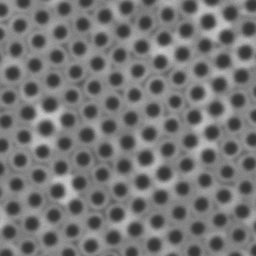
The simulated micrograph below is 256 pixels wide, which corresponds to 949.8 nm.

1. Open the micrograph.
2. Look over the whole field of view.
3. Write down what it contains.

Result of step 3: a regular array of holes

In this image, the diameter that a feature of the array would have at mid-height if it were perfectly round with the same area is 51.3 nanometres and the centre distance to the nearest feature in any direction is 0.0877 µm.